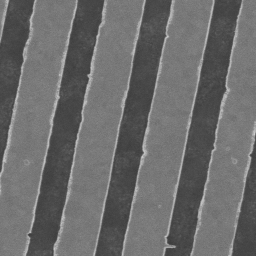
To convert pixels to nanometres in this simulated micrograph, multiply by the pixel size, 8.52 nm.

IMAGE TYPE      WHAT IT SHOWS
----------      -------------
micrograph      one or a few lines or trenches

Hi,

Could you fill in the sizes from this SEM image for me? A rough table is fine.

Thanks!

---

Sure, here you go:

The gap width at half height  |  229 nm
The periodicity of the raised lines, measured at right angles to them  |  572 nanometres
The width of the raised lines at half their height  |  343 nm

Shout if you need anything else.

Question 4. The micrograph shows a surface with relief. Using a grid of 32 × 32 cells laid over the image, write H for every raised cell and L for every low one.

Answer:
HLLLHHHHHHLLLHHHHHLLLHHHHHHLLLHH
HLLLHHHHHLLLLHHHHHLLLHHHHHLLLLHH
HLLLHHHHHLLLLHHHHHLLLHHHHHLLLLHH
LLLLHHHHHLLLHHHHHLLLLHHHHHLLLLHH
LLLLHHHHHLLLHHHHHLLLLHHHHHLLLHHH
LLLHHHHHHLLLHHHHHLLLLHHHHHLLLHHH
LLLHHHHHLLLLHHHHHLLLHHHHHLLLLHHH
LLLHHHHHLLLLHHHHHLLLHHHHHLLLLHHH
LLLHHHHHLLLHHHHHLLLLHHHHHLLLLHHH
LLLHHHHHLLLHHHHHLLLLHHHHHLLLHHHH
LLHHHHHHLLLHHHHHLLLLHHHHHLLLHHHH
LLHHHHHLLLLHHHHHLLLHHHHHHLLLHHHH
LLHHHHHLLLLHHHHHLLLHHHHHLLLLHHHH
LLHHHHHLLLHHHHHLLLLHHHHHLLLLHHHH
LLHHHHHLLLHHHHHLLLLHHHHHLLLHHHHH
LHHHHHHLLLHHHHHLLLHHHHHHLLLHHHHH
LHHHHHLLLLHHHHHLLLHHHHHLLLLHHHHH
LHHHHHLLLLHHHHHLLLHHHHHLLLLHHHHH
LHHHHHLLLHHHHHLLLLHHHHHLLLLHHHHH
LHHHHHLLLHHHHHLLLLHHHHHLLLHHHHHL
HHHHHHLLLHHHHHLLLLHHHHHLLLHHHHHL
HHHHHLLLLHHHHHLLLHHHHHHLLLHHHHHL
HHHHHLLLLHHHHHLLLHHHHHLLLLHHHHHL
HHHHHLLLHHHHHHLLLHHHHHLLLLHHHHHL
HHHHHLLLHHHHHLLLLHHHHHLLLHHHHHLL
HHHHLLLLHHHHHLLLLHHHHHLLLHHHHHLL
HHHHLLLLHHHHHLLLHHHHHHLLLHHHHHLL
HHHHLLLLHHHHHLLLHHHHHLLLLHHHHHLL
HHHHLLLLHHHHHLLLHHHHHLLLLHHHHHLL
HHHHLLLHHHHHLLLLHHHHHLLLHHHHHLLL
HHHHLLLHHHHHLLLHHHHHHLLLHHHHHLLL
HHHLLLLHHHHHLLLHHHHHHLLLHHHHHLLL